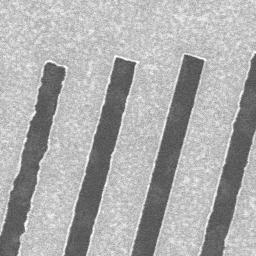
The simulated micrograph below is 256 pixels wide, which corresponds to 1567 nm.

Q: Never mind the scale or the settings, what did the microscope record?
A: one or a few lines or trenches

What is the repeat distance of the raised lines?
405 nm